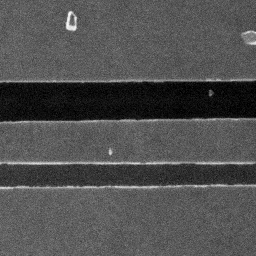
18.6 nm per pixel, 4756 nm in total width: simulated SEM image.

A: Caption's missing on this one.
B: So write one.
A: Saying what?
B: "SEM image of lines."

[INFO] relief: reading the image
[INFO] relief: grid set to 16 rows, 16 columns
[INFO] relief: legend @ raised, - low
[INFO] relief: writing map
@@@@@@@@@@@@@@@@
@@@@@@@@@@@@@@@@
@@@@@@@@@@@@@@@@
@@@@@@@@@@@@@@@@
@@@@@@@@@@@@@@@@
----------------
----------------
---------@@@@@@@
@@@@@@@@@@@@@@@@
@@@@@@@@@@@@@@@@
@@@@@@@@@@@@@@@@
@@@@@@@@@@@@@@@@
@@@@@@@@@@@@@@@@
@@@@@@@@@@@@@@@@
@@@@@@@@@@@@@@@@
@@@@@@@@@@@@@@@@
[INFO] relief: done